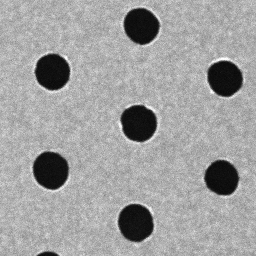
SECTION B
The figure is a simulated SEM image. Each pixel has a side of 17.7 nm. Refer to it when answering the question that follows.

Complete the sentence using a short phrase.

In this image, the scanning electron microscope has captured holes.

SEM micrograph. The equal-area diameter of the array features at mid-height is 658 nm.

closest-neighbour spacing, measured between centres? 1.72 microns